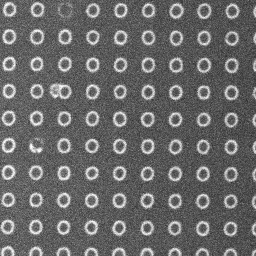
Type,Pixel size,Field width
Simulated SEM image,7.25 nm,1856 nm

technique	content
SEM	a regular array of raised bodies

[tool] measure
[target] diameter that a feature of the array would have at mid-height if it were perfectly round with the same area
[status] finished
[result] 90 nm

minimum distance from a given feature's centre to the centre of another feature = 196 nm